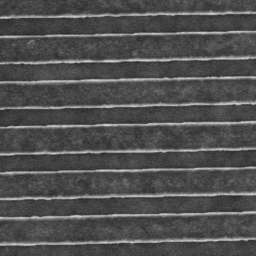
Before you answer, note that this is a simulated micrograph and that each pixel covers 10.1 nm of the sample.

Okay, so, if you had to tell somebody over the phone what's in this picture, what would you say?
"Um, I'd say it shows lines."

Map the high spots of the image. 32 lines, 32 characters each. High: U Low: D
UUUUUUUUUUUUUUUUUUUUUUUUUUUUUUUU
UUUUUUUUUUUUUUUUUUUUUUUUUUUUUUUU
DDDDDDDDDDDDDDDDDDDDDDDDDDDDDDDD
DDDDDDDDDDDDDDDDDDDDDDDDDDDDDDDD
DDDDDDUUUUUUUUUUUUUUUUUUUUUUUUUU
UUUUUUUUUUUUUUUUUUUUUUUUUUUUUUUU
UUUUUUUUUUUUUUUUUUUUUUUUUUUUUUUU
UUUUUUUUUUUUUUUUUUUUUDDDDDDDDDDD
DDDDDDDDDDDDDDDDDDDDDDDDDDDDDDDD
DDDDDDDDDDDDDDDDDDDDDDDDDDDDDDDD
UUUUUUUUUUUUUUUUUUUUUUUUUUUUUUUU
UUUUUUUUUUUUUUUUUUUUUUUUUUUUUUUU
UUUUUUUUUUUUUUUUUUUUUUUUUUUUUUUU
UUUUUUUDDDDDDDDDDDDDDDDDDDDDDDDD
DDDDDDDDDDDDDDDDDDDDDDDDDDDDDDDD
DDDDDDDDDDDDDDDDDDDUUUUUUUUUUUUU
UUUUUUUUUUUUUUUUUUUUUUUUUUUUUUUU
UUUUUUUUUUUUUUUUUUUUUUUUUUUUUUUU
UUUUUUUUUUUUUUUUUUUUUUUUUUUUUUUU
DDDDDDDDDDDDDDDDDDDDDDDDDDDDDDDD
DDDDDDDDDDDDDDDDDDDDDDDDDDDDDDDD
DDDDDDDUUUUUUUUUUUUUUUUUUUUUUUUU
UUUUUUUUUUUUUUUUUUUUUUUUUUUUUUUU
UUUUUUUUUUUUUUUUUUUUUUUUUUUUUUUU
UUUUUUUUUUUUUUUUUUUUDDDDDDDDDDDD
DDDDDDDDDDDDDDDDDDDDDDDDDDDDDDDD
DDDDDDDDDDDDDDDDDDDDDDDDDDDDDDDD
UUUUUUUUUUUUUUUUUUUUUUUUUUUUUUUU
UUUUUUUUUUUUUUUUUUUUUUUUUUUUUUUU
UUUUUUUUUUUUUUUUUUUUUUUUUUUUUUUU
UDDDDDDDDDDDDDDDDDDDDDDDDDDDDDDD
DDDDDDDDDDDDDDDDDDDDDDDDDDDDDDDD